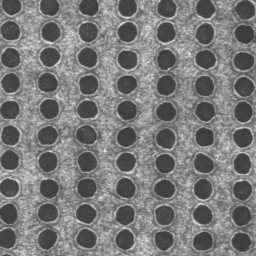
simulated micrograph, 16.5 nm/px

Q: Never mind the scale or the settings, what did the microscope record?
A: a regular array of holes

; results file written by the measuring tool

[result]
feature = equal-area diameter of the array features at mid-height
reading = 20.2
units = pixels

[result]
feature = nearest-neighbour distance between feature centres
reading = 419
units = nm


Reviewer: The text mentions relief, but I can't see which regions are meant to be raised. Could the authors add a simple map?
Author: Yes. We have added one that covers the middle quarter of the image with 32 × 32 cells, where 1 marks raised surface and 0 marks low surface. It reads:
11111000111111000011111100011111
11111111111111100111111110111111
11111111111111111111111111111111
11110000111111000011111100011111
11110000011110000011111000001111
11110000011110000011111000001111
11110000111110000111111000001111
11111001111111101111111100011111
11111111111111111111111111111111
11110001111111000111111111111111
11100000111110000011111100011111
11100000111110000011111000001111
11100000111110000011111000001111
11111000111111000011111100001111
11111111111111111111111111111111
11110001111111111111111111111111
11100000111111000111111100011111
11100000111111000011111000001111
11100000111110000011111000001111
11110000111110000011111000001111
11111111111111000111111100011111
11111111111111111111111111111111
11110001111111000111111110111111
11100000111110000011111000001111
11100000111110000011111000001111
11110000111110000011111000001111
11110001111111000111111100011111
11111111111111111111111110111111
11111111111111001111111111111111
11110000111110000111111000011111
11100000111110000011111000001111
11100000111110000011110000001111